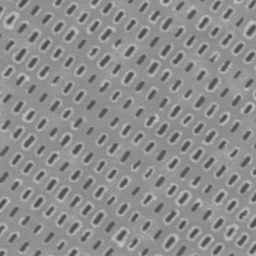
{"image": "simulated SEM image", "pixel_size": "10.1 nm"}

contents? a regular array of holes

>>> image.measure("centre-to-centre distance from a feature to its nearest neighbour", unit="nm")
145